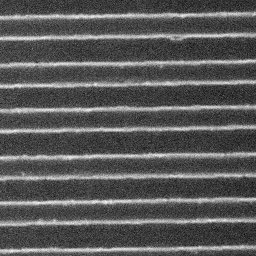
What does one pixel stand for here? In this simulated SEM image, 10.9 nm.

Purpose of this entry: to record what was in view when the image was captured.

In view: lines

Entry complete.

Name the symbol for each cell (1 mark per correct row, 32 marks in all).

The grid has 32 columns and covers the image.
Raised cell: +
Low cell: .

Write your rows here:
................................
................................
++++++++++++++++++++++++++++++++
++++++++++++++++++++++++++++++++
+++++++++++++++++++.............
................................
................................
................................
++++++++++++++++++++++++++++++++
++++++++++++++++++++++++++++++++
++++++++++++....................
................................
................................
.........................+++++++
++++++++++++++++++++++++++++++++
++++++++++++++++++++++++++++++++
................................
................................
................................
...................++......+++++
++++++++++++++++++++++++++++++++
++++++++++++++++++++++++++++++++
................................
................................
................................
++++++++++++++++++++++++++++++++
++++++++++++++++++++++++++++++++
+++++++++++++++++++++++++.......
................................
................................
................................
++++++++++++++++++++++++++++++++